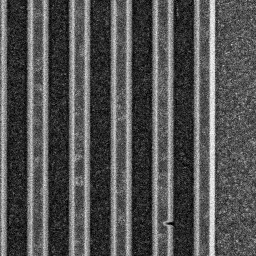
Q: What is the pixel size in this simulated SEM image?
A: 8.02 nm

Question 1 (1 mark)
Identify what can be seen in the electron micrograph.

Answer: parallel lines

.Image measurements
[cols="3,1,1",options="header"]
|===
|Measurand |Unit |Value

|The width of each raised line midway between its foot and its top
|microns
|0.13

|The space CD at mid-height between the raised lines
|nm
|200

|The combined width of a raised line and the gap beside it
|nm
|334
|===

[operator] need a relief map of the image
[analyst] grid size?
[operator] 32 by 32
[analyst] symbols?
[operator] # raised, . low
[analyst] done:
#...##...##...##...##....##.....
#...##...##...##...##....##.....
#...##...##...##...##....##.....
#...##...##...##...##....##.....
#...##...##...##...##....##.....
#...##...##...##...##....##.....
#...##...##...##...##....##.....
#...##...##...##...##....##.....
#...##...##...##...##....##.....
#...##...##...##...##....##.....
#...##...##...##...##....##.....
#...##...##...##...##....##.....
#...##...##...##...##....##.....
#...##...##...##...##....##.....
#...##...##...##...##....##.....
#...##...##...##...##....##.....
#...##...##...##...##....##.....
#...##...##...##...##....##.....
#...##...##...##...##....##.....
#...##...##...##...##....##.....
#...##...##...##...##....##.....
#...##...##...##...##....##.....
#...##...##...##...##....##.....
#...##...##...##...##....##.....
#...##...##...##...##....##.....
#...##...##...##...##....##.....
#...##...##...##...##....##.....
#...##...##...##...##....##.....
#...##...##...##...##....##.....
#...##...##...##...##....##.....
#...##...##...##...##....##.....
#...##...##...##...##....##.....